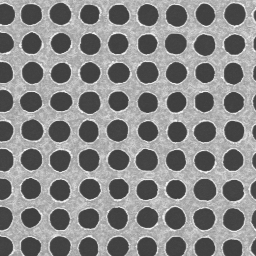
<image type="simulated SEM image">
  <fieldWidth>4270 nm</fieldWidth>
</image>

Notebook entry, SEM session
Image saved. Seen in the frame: a regular array of holes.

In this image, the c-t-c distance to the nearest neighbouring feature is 475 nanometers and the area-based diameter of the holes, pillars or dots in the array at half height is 351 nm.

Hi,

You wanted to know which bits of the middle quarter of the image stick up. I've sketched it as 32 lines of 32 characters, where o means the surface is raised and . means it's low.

.oooo...oooo....ooo....ooo....oo
..oo.....oo.....oo.....ooo.....o
..oo.....oo.....oo......o......o
.ooo.....oo.....ooo....ooo....oo
.oooo...oooo...oooo...ooooo..ooo
oooooooooooooooooooooooooooooooo
oooooooooooooooooooooooooooooooo
.oooo...oooo...oooo...ooooo...oo
..oo.....oo.....ooo....ooo....oo
..oo.....oo.....oo......o......o
..oo.....oo.....ooo....ooo....oo
.ooo.....ooo...oooo....ooo....oo
oooooo.ooooooooooooooooooooooooo
oooooooooooooooooooooooooooooooo
ooooo..ooooo...ooooo..ooooo..ooo
.ooo....ooo.....ooo....ooo....oo
..oo.....o......oo......oo.....o
..oo.....oo.....ooo.....oo.....o
.ooo....ooo....oooo....ooo....oo
ooooo..oooooo.ooooooooooooo..ooo
oooooooooooooooooooooooooooooooo
ooooo...oooo..oooooo.ooooooo.ooo
.ooo.....oo.....oo.....ooo....oo
..oo.....oo.....oo.....ooo....oo
..oo.....oo.....oo.....oo......o
.ooo.....ooo....oo.....ooo....oo
ooooo...ooooo..oooo...ooooo..ooo
oooooooooooooooooooooooooooooooo
oooooooooooooooooooooooooooooooo
.oooo...oooo...oooo....ooo....oo
.ooo.....oo.....oo.....ooo....oo
..oo.....oo.....oo.....oo......o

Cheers